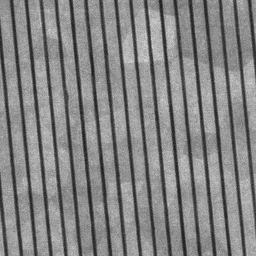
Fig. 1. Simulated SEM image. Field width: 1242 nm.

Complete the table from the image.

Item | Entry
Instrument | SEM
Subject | parallel lines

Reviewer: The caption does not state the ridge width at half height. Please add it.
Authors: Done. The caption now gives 0.0524 micrometres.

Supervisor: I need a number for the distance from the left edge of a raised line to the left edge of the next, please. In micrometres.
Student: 0.0718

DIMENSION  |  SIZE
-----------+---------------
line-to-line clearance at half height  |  17.5 nm